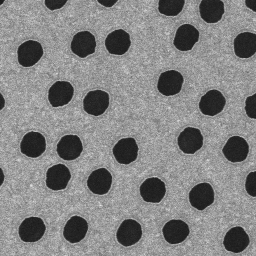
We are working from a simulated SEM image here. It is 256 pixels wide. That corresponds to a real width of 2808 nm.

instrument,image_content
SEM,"a regular array of holes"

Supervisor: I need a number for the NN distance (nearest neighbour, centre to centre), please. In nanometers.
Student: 478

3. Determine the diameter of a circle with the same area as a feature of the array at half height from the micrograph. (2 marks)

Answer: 286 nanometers